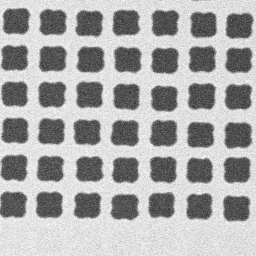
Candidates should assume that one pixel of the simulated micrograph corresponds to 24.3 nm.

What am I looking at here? a regular array of holes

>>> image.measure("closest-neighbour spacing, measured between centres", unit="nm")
873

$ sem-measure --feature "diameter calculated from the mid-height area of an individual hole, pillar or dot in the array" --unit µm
0.714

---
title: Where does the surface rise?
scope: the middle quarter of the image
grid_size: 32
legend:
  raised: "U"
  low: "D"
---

DUUDDDDDDDUUDDDDDDDUUDDDDDDDDUUD
UUUDDDDDDDUUUDDDDDDUUUDDDDDDDUUD
UUUUUUUUUUUUUUUUUUUUUUUDUDDUUUUU
UUUUUUUUUUUUUUUUUUUUUUUUUUUUUUUU
UUUUDDDDDUUUUUUUUUUUUUUUUUUUUUUU
DUUDDDDDDDUUUDDDDDDUUUUDDDDUUUUD
DUUDDDDDDDUUDDDDDDDUUUDDDDDDUUUD
UUUDDDDDDDUUDDDDDDDUUUDDDDDDDUUD
UUUDDDDDDDUUDDDDDDDUUUDDDDDDUUUD
UUUDDDDDDDUUDDDDDDDUUUDDDDDDDUUD
UUUDDDDDDUUUDDDDDDDUUUDDDDDDUUUD
UUUUUUUUUUUUUUUUDDUUUUDDDDDDUUUU
UUUUUUUUUUUUUUUUUUUUUUUUUUUUUUUU
UUUUUUUUUUUUUUUUUUUUUUUUUUUUUUUU
UUUDDDDDDUUUDDDDDDDUUUDDDDDDUUUU
UUDDDDDDDUUUDDDDDDDUUUDDDDDDDUUD
UUDDDDDDDUUUDDDDDDDUUUDDDDDDUUUD
UUDDDDDDDUUUDDDDDDDUUUDDDDDDUUUD
UUDDDDDDDUUDDDDDDDDUUDDDDDDDUUUD
UUUDDDDDDUUUDDDDDDDUUDDDDDDDUUUD
UUUUUUUDUUUUUDDUDDUUUUDDDDDUUUUD
UUUUUUUUUUUUUUUUUUUUUUUUUUUUUUUU
UUUUUUUUUUUUUUUUUUUUUUUUUUUUUUUU
UUUDDDDDDUUUUDDDDDUUUUDDDDDDUUUD
UUUDDDDDDDUUDDDDDDDUUDDDDDDDUUUD
UUUDDDDDDDUUDDDDDDDUUDDDDDDDUUDD
UUUDDDDDDDUUDDDDDDDUUDDDDDDDUUDD
UUUDDDDDDDUUDDDDDDDUUDDDDDDDUUDD
UUUDDDDDDDUUDDDDDDDUUDDDDDDDUUUD
UUUUDDDDDUUUUDDDDDUUUUDDDDDUUUUD
UUUUUUUUUUUUUUUUUUUUUUUUUUUUUUUU
UUUUUUUUUUUUUUUUUUUUUUUUUUUUUUUU